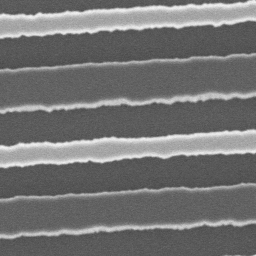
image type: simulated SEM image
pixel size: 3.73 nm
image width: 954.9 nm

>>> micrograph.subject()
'lines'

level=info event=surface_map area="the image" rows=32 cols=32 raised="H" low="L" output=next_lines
LLLLLLLLLLLLLLLLLLLLLLLLLLLHLHHH
LLLLLLLLHHHHHHHHHHHHHHHHHHHHHHHH
HHHHHHHHHHHHHHHHHHHHHHHHHHHHHHHH
HHHHHHHHHHHHHHHHHHLLLLLLLLLLLLLL
HHHHLLLLLLLLLLLLLLLLLLLLLLLLLLLL
LLLLLLLLLLLLLLLLLLLLLLLLLLLLLLLL
LLLLLLLLLLLLLLLLLLLLLLLLLLLLLLLL
LLLLLLLLLLLLLLLLLLLHHHHHHHHHHHHH
LLLLLHHHHHHHHHHHHHHHHHHHHHHHHHHH
HHHHHHHHHHHHHHHHHHHHHHHHHHHHHHHH
HHHHHHHHHHHHHHHHHHHHHHHHHHHHHHHH
HHHHHHHHHHHHHHHHHHHHHHHHHHHHHHHH
HHHHHHHHHHHHHHHHHHHHHHLLLLLLLLLL
HHHHHHHLLLLLLLLLLLLLLLLLLLLLLLLL
LLLLLLLLLLLLLLLLLLLLLLLLLLLLLLLL
LLLLLLLLLLLLLLLLLLLLLLLLLLLLLLLL
LLLLLLLLLLLLLLLLLLLLLLLLLLLHHHHH
LLLLLLLLLLLLHHHHHHHHHHHHHHHHHHHH
HHHHHHHHHHHHHHHHHHHHHHHHHHHHHHHH
HHHHHHHHHHHHHHHHHHHHHHLLLLLLLLLL
HHHHHLLHLLLLLLLLLLLLLLLLLLLLLLLL
LLLLLLLLLLLLLLLLLLLLLLLLLLLLLLLL
LLLLLLLLLLLLLLLLLLLLLLLLLLLLLLLL
LLLLLLLLLLLLLLLLLLLLLLHLLLHHHHHH
LLLLLLLHHHHHHHHHHHHHHHHHHHHHHHHH
HHHHHHHHHHHHHHHHHHHHHHHHHHHHHHHH
HHHHHHHHHHHHHHHHHHHHHHHHHHHHHHHH
HHHHHHHHHHHHHHHHHHHHHHHHHHHHHHHH
HHHHHHHHHHHHHHHHHHHLLLLLLLLLLLLL
HHLLLLLLLLLLLLLLLLLLLLLLLLLLLLLL
LLLLLLLLLLLLLLLLLLLLLLLLLLLLLLLL
LLLLLLLLLLLLLLLLLLLLLLLLLLLLLLLL